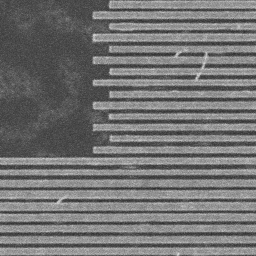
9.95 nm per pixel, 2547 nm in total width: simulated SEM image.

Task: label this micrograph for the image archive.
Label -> parallel lines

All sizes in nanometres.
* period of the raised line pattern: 112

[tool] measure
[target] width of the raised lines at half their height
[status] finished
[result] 6.87 pixels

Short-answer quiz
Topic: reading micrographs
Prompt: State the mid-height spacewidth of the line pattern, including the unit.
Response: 43.5 nm